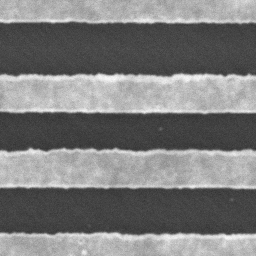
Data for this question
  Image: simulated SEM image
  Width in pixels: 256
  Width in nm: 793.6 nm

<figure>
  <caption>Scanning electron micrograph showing lines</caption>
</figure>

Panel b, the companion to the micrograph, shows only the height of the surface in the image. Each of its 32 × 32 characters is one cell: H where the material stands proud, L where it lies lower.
HHHHHHHHHHHHHHHHHHHHHHHHHHHHHHHH
HHHHHHHHHHHHHHHHHHHHHHHHHHHHHHHH
HHHHHHHHHHHHHHHHHHHHHHHHHHHHHHHH
LLLLLLLLLLLLLLLLLLLLLLLLLLLLLLLL
LLLLLLLLLLLLLLLLLLLLLLLLLLLLLLLL
LLLLLLLLLLLLLLLLLLLLLLLLLLLLLLLL
LLLLLLLLLLLLLLLLLLLLLLLLLLLLLLLL
LLLLLLLLLLLLLLLLLLLLLLLLLLLLLLLL
LLLLLLLLLLLLLLLLLLLLLLLLLLLLLLLL
HLLHHHLLHHHLHLHHHLLLLLHHHHHHHHLH
HHHHHHHHHHHHHHHHHHHHHHHHHHHHHHHH
HHHHHHHHHHHHHHHHHHHHHHHHHHHHHHHH
HHHHHHHHHHHHHHHHHHHHHHHHHHHHHHHH
HHHHHHHHHHHHHHHHHHHHHHHHHHHHHHHH
LLLLLLLLLLLLLLLLLLLLLLLLLLLLLLLL
LLLLLLLLLLLLLLLLLLLLLLLLLLLLLLLL
LLLLLLLLLLLLLLLLLLLLLLLLLLLLLLLL
LLLLLLLLLLLLLLLLLLLLLLLLLLLLLLLL
LLLLLLLLLLLLLLLLLLLLLLLLLLLLLLLL
HHHHHHHHHHHHHHHHHHHHHHHHHHHHHHHH
HHHHHHHHHHHHHHHHHHHHHHHHHHHHHHHH
HHHHHHHHHHHHHHHHHHHHHHHHHHHHHHHH
HHHHHHHHHHHHHHHHHHHHHHHHHHHHHHHH
LLLLLLLLHLLLLHLLHLLLHLHLLLLLLHHH
LLLLLLLLLLLLLLLLLLLLLLLLLLLLLLLL
LLLLLLLLLLLLLLLLLLLLLLLLLLLLLLLL
LLLLLLLLLLLLLLLLLLLLLLLLLLLLLLLL
LLLLLLLLLLLLLLLLLLLLLLLLLLLLLLLL
LLLLLLLLLLLLLLLLLLLLLLLLLLLLLLLL
HHHHHHHHHHHHHHHHHLHHHHHHHHHHLHHH
HHHHHHHHHHHHHHHHHHHHHHHHHHHHHHHH
HHHHHHHHHHHHHHHHHHHHHHHHHHHHHHHH